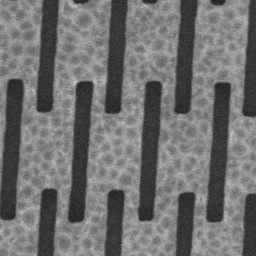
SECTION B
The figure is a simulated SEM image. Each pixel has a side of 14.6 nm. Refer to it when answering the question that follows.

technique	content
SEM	holes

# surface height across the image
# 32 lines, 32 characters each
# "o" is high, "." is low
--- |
ooooo..ooooooo..oooooo...o..ooo.
ooooo..ooooooo..oooooo...oooooo.
ooooo..ooooooo..oooooo..ooooooo.
ooooo..ooooooo..oooooo..ooooooo.
ooooo..oooooo...oooooo..ooooooo.
ooooo..oooooo...oooooo..ooooooo.
ooooo..oooooo...oooooo..ooooooo.
ooooo..oooooo...oooooo..ooooooo.
ooooo..oooooo...oooooo..ooooooo.
ooooo..oooooo...oooooo..ooooooo.
o..oo..ooo..o..ooo..oo..ooo..o..
o..oo..oo...o..ooo..oo..ooo..o..
o..oo..oo...o..ooo..oo..ooo..o..
o..o...oo...o..ooo..oo..ooo..o..
o..oooooo..ooooooo..ooooooo..oo.
o..oooooo..ooooooo..oooooo...ooo
o..oooooo..ooooooo..oooooo...ooo
...oooooo..ooooooo..oooooo...ooo
..ooooooo..ooooooo..oooooo..oooo
..ooooooo..ooooooo..oooooo..oooo
..ooooooo..ooooooo..oooooo..oooo
..ooooooo..ooooooo..oooooo..oooo
..ooooooo..oooooo...oooooo..oooo
..ooooooo..oooooo...oooooo..oooo
..ooo..oo..oo...o...oo..oo..ooo.
..ooo..oo..oo...o..ooo..oo..ooo.
..ooo..oo..oo...o..ooo..oo..oo..
..ooo..oo.ooo..oo..ooo..oo..oo..
ooooo..oooooo..ooooooo..oooooo..
ooooo..oooooo..ooooooo..oooooo..
ooooo..oooooo..ooooooo..oooooo..
ooooo..oooooo..ooooooo..oooooo..